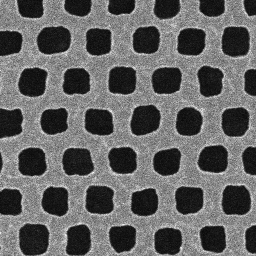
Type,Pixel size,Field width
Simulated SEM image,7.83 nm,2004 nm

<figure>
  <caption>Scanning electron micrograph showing a regular array of holes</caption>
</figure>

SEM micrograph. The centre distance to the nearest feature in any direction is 345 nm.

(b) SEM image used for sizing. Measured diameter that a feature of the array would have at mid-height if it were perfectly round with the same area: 230 nanometers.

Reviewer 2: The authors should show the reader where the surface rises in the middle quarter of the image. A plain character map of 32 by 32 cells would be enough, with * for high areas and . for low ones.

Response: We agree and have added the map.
********************************
*.....******......*****......***
......*****.......****........**
.......****.......****........**
.......****.......****.......***
.......****.......****.......***
.......****.......****.......***
*....**********.****************
********************************
********************************
*******************....*********
.*****....*******.......*****...
.****.......*****.......****....
.****.......*****.......****....
.****.......*****.......****....
.****.......*****.......****....
.*****......*****......*****....
*******.....*****....********...
********************************
********************************
********************************
*.....******.....*******.....***
.......****.......*****......***
.......****.......****.......***
.......****.......****.......***
........***.......****.......***
.......*****......*****......***
......******************....****
********************************
********************************
*******....*********************
.*****......********...*****....